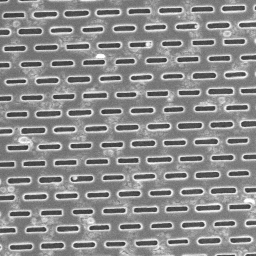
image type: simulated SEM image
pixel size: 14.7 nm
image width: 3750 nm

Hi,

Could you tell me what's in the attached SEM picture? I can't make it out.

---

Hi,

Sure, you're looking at a regular array of holes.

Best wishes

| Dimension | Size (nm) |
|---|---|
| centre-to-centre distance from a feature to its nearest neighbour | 328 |